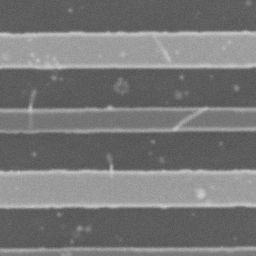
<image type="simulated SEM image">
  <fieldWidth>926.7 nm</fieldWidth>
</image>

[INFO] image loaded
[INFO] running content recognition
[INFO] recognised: lines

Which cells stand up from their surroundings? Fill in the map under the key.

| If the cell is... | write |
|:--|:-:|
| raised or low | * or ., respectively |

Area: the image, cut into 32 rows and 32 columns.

................................
................................
................................
................................
********************************
********************************
********************************
********************************
....****........................
................................
................................
................................
................................
.........................*......
********************************
********************************
...*............................
................................
................................
................................
................................
********************************
********************************
********************************
********************************
********************************
................................
................................
................................
................................
................................
********************************